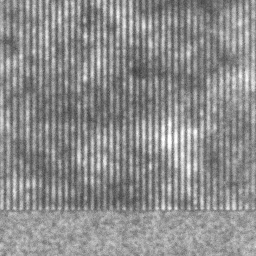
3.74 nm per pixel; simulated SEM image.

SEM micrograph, parallel lines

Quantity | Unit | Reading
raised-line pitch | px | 6.44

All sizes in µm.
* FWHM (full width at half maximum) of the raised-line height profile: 0.0103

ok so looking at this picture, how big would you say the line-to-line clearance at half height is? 14 nm